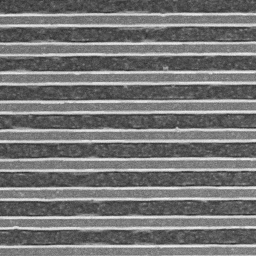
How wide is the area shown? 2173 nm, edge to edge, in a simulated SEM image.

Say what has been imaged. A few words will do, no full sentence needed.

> parallel lines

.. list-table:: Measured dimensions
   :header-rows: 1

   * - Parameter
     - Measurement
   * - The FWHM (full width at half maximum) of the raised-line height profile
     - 95.5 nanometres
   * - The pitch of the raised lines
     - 0.246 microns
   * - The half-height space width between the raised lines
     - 151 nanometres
